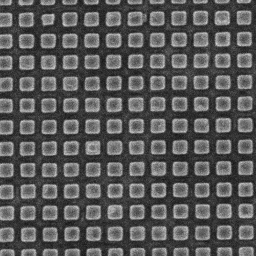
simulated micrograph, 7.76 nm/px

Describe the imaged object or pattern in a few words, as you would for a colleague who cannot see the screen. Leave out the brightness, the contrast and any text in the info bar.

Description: a regular array of raised bodies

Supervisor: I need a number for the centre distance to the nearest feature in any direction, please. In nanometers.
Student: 165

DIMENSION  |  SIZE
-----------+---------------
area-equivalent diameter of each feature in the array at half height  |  118 nanometres